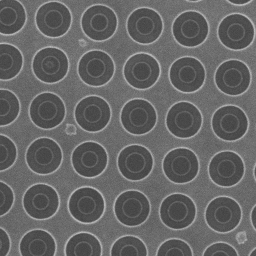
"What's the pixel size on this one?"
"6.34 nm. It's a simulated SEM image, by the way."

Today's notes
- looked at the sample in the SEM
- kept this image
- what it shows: an array of small figures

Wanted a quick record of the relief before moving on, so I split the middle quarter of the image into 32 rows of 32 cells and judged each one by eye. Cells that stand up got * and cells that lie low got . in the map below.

.**...****...**...***...***.....
.***..****...**..*****..***..***
****..****..***..*****..**...***
****........***...***...**...***
*****......*****.......****...**
*******..********.....*****.....
*****************************...
********************************
*****....***********************
****.......*****.....********.**
***...**...****.......*****.....
***..****...***..***...***......
***..****...**...****..***...***
***..****...**..*****..***..****
***........***...****..**...****
****......*****........***..****
*****....*******......****......
*****************...*******.....
*****************************..*
******.*************************
***......*******...*************
***.......*****......******.....
**...***...***...**...****......
**...***...***..****..***...**..
**...***...**..*****..***..****.
**...**....**...****..***..****.
***.......****..***...***..****.
****.....*****.......****...**..
***************.....******......
***************************....*
********************************
***.....************************